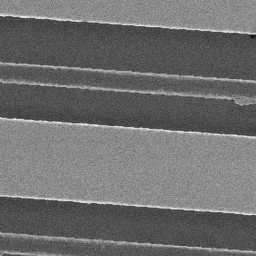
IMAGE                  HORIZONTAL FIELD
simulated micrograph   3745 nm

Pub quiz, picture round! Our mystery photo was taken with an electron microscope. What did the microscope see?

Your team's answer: lines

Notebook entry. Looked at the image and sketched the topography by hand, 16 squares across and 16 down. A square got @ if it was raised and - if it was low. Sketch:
@@@@@@@@@@@@@@@@
-------@@@@@@@@@
----------------
----------------
----------------
----------------
----------------
@@--------------
@@@@@@@@@@@@@@@-
@@@@@@@@@@@@@@@@
@@@@@@@@@@@@@@@@
@@@@@@@@@@@@@@@@
---@@@@@@@@@@@@@
----------------
----------------
----------------